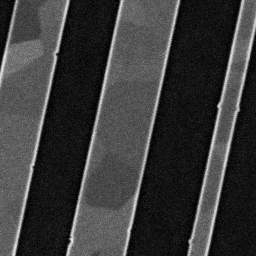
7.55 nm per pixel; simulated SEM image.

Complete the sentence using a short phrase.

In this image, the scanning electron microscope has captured one or a few lines or trenches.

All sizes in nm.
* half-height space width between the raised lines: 438